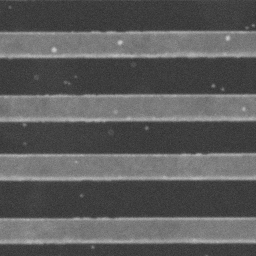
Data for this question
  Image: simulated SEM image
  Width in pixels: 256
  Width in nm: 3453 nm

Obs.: lines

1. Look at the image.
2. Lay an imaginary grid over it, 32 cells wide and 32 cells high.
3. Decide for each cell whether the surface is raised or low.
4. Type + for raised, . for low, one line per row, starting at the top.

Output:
................................
................................
................................
................................
++++++++++++++++++++++++++++++++
++++++++++++++++++++++++++++++++
++++++++++++++++++++++++++++++++
................................
................................
................................
................................
................................
++++++++++++++++++++++++++++++++
++++++++++++++++++++++++++++++++
++++++++++++++++++++++++++++++++
................................
................................
................................
................................
++++++++++++++++++++++++++++++++
++++++++++++++++++++++++++++++++
++++++++++++++++++++++++++++++++
................................
................................
................................
................................
................................
++++++++++++++++++++++++++++++++
++++++++++++++++++++++++++++++++
++++++++++++++++++++++++++++++++
................................
................................